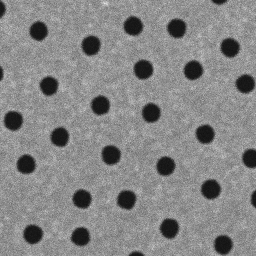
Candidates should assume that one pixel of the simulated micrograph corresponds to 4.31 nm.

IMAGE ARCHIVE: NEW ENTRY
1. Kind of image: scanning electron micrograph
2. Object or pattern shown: a regular array of holes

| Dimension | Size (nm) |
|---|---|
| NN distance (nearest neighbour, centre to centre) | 194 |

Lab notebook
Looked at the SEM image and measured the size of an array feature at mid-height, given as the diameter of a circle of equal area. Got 19.2 pixels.